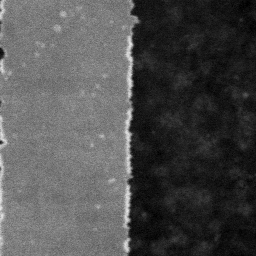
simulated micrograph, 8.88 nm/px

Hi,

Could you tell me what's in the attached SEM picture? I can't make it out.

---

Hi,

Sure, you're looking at one or a few lines or trenches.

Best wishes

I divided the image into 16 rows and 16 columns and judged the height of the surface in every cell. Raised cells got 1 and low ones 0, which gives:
1111111100000000
1111111100000000
1111111100000000
1111111100000000
1111111100000000
1111111100000000
1111111100000000
1111111100000000
1111111100000000
1111111100000000
1111111100000000
1111111100000000
1111111100000000
1111111100000000
1111111100000000
1111111100000000